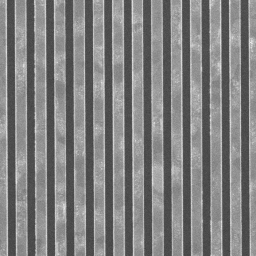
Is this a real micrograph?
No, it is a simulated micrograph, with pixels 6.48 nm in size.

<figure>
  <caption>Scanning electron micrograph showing parallel lines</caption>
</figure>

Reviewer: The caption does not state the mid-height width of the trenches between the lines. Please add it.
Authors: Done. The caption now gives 58.4 nm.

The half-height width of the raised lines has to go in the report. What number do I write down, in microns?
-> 0.0689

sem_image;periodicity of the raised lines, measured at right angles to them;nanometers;126